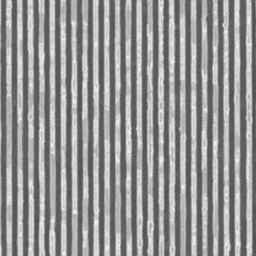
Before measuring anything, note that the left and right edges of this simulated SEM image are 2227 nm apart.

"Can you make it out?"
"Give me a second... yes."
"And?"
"parallel lines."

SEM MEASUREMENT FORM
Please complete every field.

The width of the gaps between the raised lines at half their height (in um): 0.0555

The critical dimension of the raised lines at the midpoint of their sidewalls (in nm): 40.2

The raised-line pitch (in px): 10.9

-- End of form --